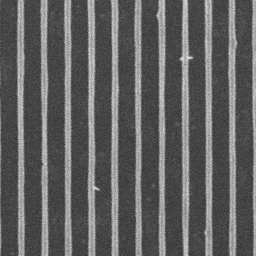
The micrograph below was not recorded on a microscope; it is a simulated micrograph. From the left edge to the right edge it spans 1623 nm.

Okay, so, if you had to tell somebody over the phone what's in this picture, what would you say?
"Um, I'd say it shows parallel lines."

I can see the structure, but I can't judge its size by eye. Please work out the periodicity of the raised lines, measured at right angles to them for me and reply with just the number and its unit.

0.149 µm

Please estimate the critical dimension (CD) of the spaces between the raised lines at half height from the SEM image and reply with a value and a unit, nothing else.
112 nm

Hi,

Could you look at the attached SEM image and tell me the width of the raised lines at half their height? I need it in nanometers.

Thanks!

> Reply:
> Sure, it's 32.5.